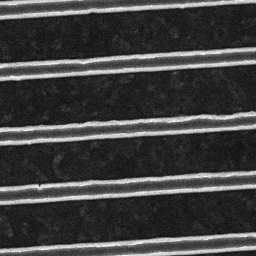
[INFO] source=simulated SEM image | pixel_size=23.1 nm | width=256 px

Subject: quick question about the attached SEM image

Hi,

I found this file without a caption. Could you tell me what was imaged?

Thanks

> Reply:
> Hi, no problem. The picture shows one or a few lines or trenches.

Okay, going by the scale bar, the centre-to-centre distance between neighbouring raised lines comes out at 1420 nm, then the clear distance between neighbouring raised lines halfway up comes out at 1.09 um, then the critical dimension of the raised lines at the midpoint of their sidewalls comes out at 319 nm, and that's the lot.